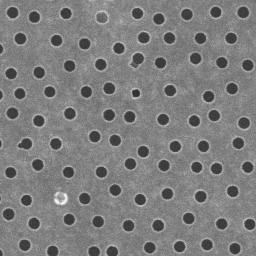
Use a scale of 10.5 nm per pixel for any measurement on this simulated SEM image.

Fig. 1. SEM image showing a regular array of holes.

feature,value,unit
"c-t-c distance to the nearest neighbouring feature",250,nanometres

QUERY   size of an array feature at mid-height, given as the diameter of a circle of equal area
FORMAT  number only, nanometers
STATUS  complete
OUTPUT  121